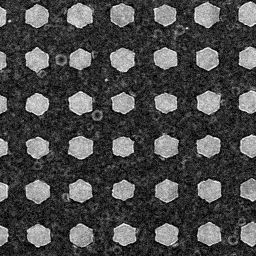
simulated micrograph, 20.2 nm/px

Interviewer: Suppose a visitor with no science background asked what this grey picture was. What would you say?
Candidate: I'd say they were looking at a regular array of raised bodies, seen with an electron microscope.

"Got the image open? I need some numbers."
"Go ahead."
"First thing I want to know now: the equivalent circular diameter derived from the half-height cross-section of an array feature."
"452 nm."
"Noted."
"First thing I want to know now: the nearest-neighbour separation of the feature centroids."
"0.859 microns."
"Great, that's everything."